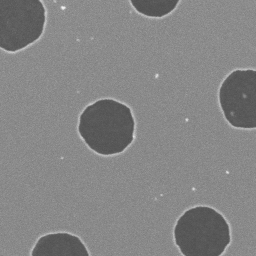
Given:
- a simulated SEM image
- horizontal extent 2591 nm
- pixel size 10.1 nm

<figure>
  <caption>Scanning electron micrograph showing holes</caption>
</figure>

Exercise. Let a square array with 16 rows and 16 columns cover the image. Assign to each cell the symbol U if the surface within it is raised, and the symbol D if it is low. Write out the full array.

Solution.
DDDUUUUUDDDUUUUU
DDDUUUUUUUUUUUUU
DDUUUUUUUUUUUUUU
UUUUUUUUUUUUUUUU
UUUUUUUUUUUUUUUD
UUUUUUUUUUUUUUDD
UUUUUUDDUUUUUUDD
UUUUUDDDUUUUUUDD
UUUUUDDDUUUUUUUU
UUUUUUDUUUUUUUUU
UUUUUUUUUUUUUUUU
UUUUUUUUUUUUUUUU
UUUUUUUUUUUUUUUU
UUUUUUUUUUUDDDUU
UUUUUUUUUUUDDDUU
UUDDDUUUUUUDDDUU